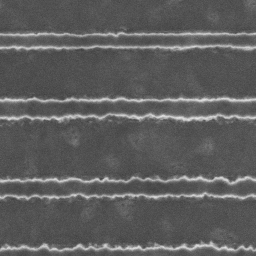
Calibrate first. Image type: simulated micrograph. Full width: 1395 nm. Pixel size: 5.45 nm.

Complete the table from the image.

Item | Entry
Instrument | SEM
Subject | one or a few lines or trenches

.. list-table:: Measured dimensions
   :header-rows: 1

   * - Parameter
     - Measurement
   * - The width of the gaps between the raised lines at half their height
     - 287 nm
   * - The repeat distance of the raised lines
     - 402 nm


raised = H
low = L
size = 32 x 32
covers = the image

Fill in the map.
LLLLLLLLLLLLLLLLLLLLLLLLLLLLLLLL
LLLLLLLLLLLLLLLLLLLLLLLLLLLLLLLL
LLLLLLLLLLLLLLLLLLLLLLLLLLLLLLLL
LLLLLLLLLLLLLLLLLLLLLLLLLLLLLLLL
HHHHHHHHHHHHHHHHHHHHHHHHHHHHHHHH
HHHHHHHHHHHHHHHHHHHHHHHHHHHHHHHH
LLLLLLLLLLLLLLLLLLLLLLLLLLLLLLLL
LLLLLLLLLLLLLLLLLLLLLLLLLLLLLLLL
LLLLLLLLLLLLLLLLLLLLLLLLLLLLLLLL
LLLLLLLLLLLLLLLLLLLLLLLLLLLLLLLL
LLLLLLLLLLLLLLLLLLLLLLLLLLLLLLLL
LLLLLLLLLLLLLLLLLLLLLLLLLLLLLLLL
HHHHHLHLHHHLHHHHHLHHHHHHLLHHHLLH
HHHHHHHHHHHHHHHHHHHHHHHHHHHHHHHH
HHHHHHHHHHHHHLLLHHLHHHHHHHHLHHHH
LLLLLLLLLLLLLLLLLLLLLLLLLLLLLLLL
LLLLLLLLLLLLLLLLLLLLLLLLLLLLLLLL
LLLLLLLLLLLLLLLLLLLLLLLLLLLLLLLL
LLLLLLLLLLLLLLLLLLLLLLLLLLLLLLLL
LLLLLLLLLLLLLLLLLLLLLLLLLLLLLLLL
LLLLLLLLLLLLLLLLLLLLLLLLLLLLLLLL
LLLLLLLLLLLLLLLLLLLLLLLLLLLLLLLL
LLLLHLHLHHLLLHLLHHHHLHHHHHHHLLHH
HHHHHHHHHHHHHHHHHHHHHHHHHHHHHHHH
HLHHHHHHHLHHHHHLLLHHHHHHHLHHHHHH
LLLLLLLLLLLLLLLLLLLLLLLLLLLLLLLL
LLLLLLLLLLLLLLLLLLLLLLLLLLLLLLLL
LLLLLLLLLLLLLLLLLLLLLLLLLLLLLLLL
LLLLLLLLLLLLLLLLLLLLLLLLLLLLLLLL
LLLLLLLLLLLLLLLLLLLLLLLLLLLLLLLL
LLLLLLLLLLLLLLLLLLLLLLLLLLLLLLLL
HHHHHHHHHHHHHHHHHHHHHHHHHHHHHHHH